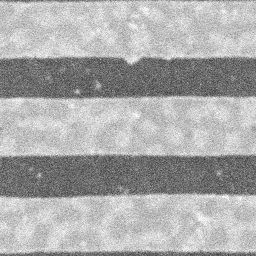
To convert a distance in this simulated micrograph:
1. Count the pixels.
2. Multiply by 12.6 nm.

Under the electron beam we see one or a few lines or trenches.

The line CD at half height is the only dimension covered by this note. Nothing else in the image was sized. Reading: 683 nm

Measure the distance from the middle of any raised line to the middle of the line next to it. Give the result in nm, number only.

1220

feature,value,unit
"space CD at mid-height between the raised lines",42.1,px